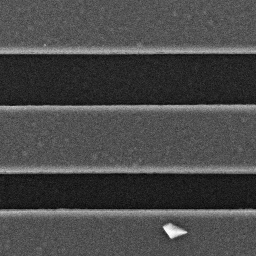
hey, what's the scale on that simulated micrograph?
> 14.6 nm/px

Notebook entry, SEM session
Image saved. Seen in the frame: lines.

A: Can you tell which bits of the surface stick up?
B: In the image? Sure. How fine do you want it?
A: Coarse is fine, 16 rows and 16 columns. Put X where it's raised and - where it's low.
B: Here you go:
XXXXXXXXXXXXXXXX
XXXXXXXXXXXXXXXX
XXXXXXXXXXXXXXXX
----------------
----------------
----------------
----------------
XXXXXXXXXXXXXXXX
XXXXXXXXXXXXXXXX
XXXXXXXXXXXXXXXX
XXXXXXXXXXXXXXXX
----------------
----------------
XXXXXXXXXXXXXXXX
XXXXXXXXXXXXXXXX
XXXXXXXXXXXXXXXX